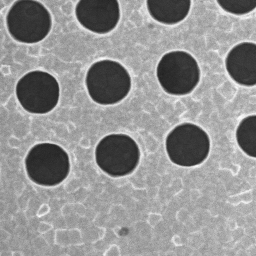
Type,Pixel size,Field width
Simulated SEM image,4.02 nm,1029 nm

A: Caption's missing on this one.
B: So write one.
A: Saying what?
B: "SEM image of holes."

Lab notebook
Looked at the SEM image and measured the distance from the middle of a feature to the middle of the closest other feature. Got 284 nm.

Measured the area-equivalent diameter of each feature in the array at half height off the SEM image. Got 0.174 microns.